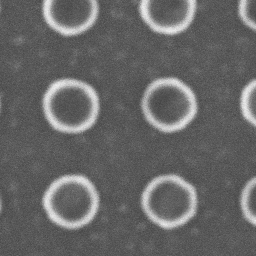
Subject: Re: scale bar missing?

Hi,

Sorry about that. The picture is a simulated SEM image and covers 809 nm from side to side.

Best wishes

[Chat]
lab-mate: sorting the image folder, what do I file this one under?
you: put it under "raised bodies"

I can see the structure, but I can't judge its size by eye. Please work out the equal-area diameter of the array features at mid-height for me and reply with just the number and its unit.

156 nanometers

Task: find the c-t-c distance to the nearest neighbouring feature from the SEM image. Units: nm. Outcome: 303